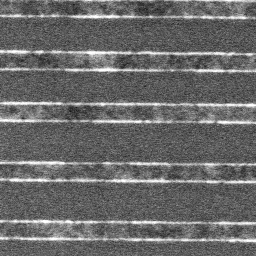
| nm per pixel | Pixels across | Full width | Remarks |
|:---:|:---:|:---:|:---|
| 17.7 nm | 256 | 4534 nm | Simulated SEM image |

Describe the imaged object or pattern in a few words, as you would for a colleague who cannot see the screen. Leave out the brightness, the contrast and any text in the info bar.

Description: lines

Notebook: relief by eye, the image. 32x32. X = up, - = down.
XXXXXXXXXXXXXXXXXXXXXXXXXXXXXXXX
XXXXXXXXXXXXXXXXXXXXXXXXXXXXXXXX
--------------------------------
--------------------------------
--------------------------------
--------------------------------
XXXX----------------------------
XXXXXXXXXXXXXXXXXXXXXXXXXXXXXXXX
XXXXXXXXXXXXXXXXXXXXXXXXXXXXXXXX
--------------------------------
--------------------------------
--------------------------------
--------------------------------
XXXXXXXXXXXXXXXXXXXXXXXXXXXXXXXX
XXXXXXXXXXXXXXXXXXXXXXXXXXXXXXXX
--------------------------------
--------------------------------
--------------------------------
--------------------------------
--------------------------------
XXXXXXXXXXXXXXXXXXXX------------
XXXXXXXXXXXXXXXXXXXXXXXXXXXXXXXX
--XXXXXXXXXXXXXXXXXXXXXXXXXXXXXX
--------------------------------
--------------------------------
--------------------------------
--------------------------------
--------------------------------
XXXXXXXXXXXXXXXXXXXXXXXXXXXXXXXX
XXXXXXXXXXXXXXXXXXXXXXXXXXXXXXXX
--------------------------------
--------------------------------